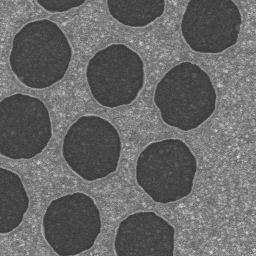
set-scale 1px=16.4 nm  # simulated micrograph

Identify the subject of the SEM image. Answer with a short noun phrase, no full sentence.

holes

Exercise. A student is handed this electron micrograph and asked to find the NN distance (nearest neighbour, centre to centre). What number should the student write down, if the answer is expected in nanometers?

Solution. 1240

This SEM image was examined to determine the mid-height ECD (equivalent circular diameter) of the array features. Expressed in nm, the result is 1020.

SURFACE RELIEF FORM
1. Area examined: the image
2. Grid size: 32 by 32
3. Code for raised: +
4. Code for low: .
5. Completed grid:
+++++.....+++........++......+++
++++++..++++++......+++.......++
+++++.+++++++++....++++.......++
+++....++++++++++++++++.......++
++......+++++++++++++++.......++
++.......+++++.++++++++......+++
+........+++.....++++++++...++++
+........++.......++++++++++++++
+.......+++.......++++...+++++++
++......+++.......++......++++++
+++....++++.......++.......+++++
+++++++++++......++........+++++
.....+++++++.....++........+++++
......++++++++++++++.......+++++
......+++++.++++++++......++++++
......+++.....+++++++....+++++++
......++.......+++++++++++++++++
......++.......++++++.++++++++++
......++.......+++......++++++++
....++++.......++.......++++++++
++++++++.......++........+++++++
..+++++++.....+++.......++++++++
...++++++++.+++++.......++++++++
...+++++++++++++++......++++++++
....++++...++++++++....+++++++++
....++......++++++++++++++++++++
...+++......+++++..+++++++++++++
...++........++......+++++++++++
..+++........++.......++++++++++
++++++......++........++++++++++
++++++......++........++++++++++
+++++++...+++++.......++++++++++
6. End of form